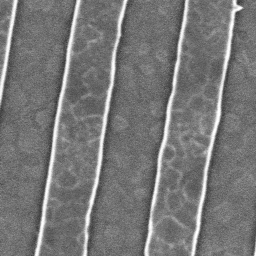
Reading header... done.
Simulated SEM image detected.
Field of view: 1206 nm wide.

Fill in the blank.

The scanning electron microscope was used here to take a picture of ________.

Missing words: one or a few lines or trenches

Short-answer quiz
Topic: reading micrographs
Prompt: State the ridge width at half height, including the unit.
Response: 225 nanometres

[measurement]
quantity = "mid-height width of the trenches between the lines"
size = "286 nm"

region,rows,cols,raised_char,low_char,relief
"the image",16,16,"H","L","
HLLLLHHHLLLLHHHL
HLLLLHHHLLLHHHHL
HLLLHHHLLLLHHHLL
LLLLHHHLLLLHHHLL
LLLLHHHLLLLHHHLL
LLLLHHHLLLLHHHLL
LLLLHHHLLLLHHHLL
LLLLHHHLLLHHHHLL
LLLHHHLLLLHHHLLL
LLLHHHLLLLHHHLLL
LLLHHHLLLLHHHLLL
LLLHHHLLLLHHHLLL
LLLHHHLLLLHHHLLL
LLLHHHLLLHHHLLLL
LLLHHLLLLHHHLLLL
LLHHHLLLLHHHLLLL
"